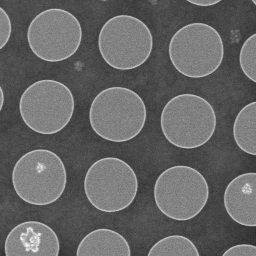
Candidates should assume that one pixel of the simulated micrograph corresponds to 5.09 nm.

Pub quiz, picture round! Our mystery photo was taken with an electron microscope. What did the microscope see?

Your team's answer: an array of small figures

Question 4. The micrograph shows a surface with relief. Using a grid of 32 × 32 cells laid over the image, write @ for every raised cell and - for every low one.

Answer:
------------------------@@@-----
@----@@@------------------------
@---@@@@@@----@@@---------------
@---@@@@@@---@@@@@-----@@@@-----
@--@@@@@@@--@@@@@@@---@@@@@----@
@---@@@@@@--@@@@@@@--@@@@@@@---@
----@@@@@----@@@@@@--@@@@@@@--@@
------@@-----@@@@@---@@@@@@@--@@
--------------@@@-----@@@@@---@@
-----------------------@@@-----@
----@@@@------------------------
---@@@@@@----@@@@---------------
---@@@@@@---@@@@@@---@@@@@------
--@@@@@@@--@@@@@@@---@@@@@@---@@
---@@@@@@--@@@@@@@--@@@@@@@---@@
---@@@@@---@@@@@@@--@@@@@@@--@@@
-----@@-----@@@@@---@@@@@@@--@@@
--------------@@-----@@@@@---@@@
-----------------------@------@@
---@@@@-------------------------
--@@@@@@----@@@@----------------
--@@@@@@---@@@@@@----@@@@-------
--@@@@@@---@@@@@@---@@@@@@---@@@
--@@@@@@---@@@@@@--@@@@@@@--@@@@
--@@@@@----@@@@@@--@@@@@@@--@@@@
----@@------@@@@----@@@@@@--@@@@
--------------------@@@@@---@@@@
-----------------------------@@@
--@@@@--------------------------
-@@@@@@----@@@@-----------------
-@@@@@@---@@@@@@---@@@@@--------
-@@@@@@---@@@@@@---@@@@@@---@@@@